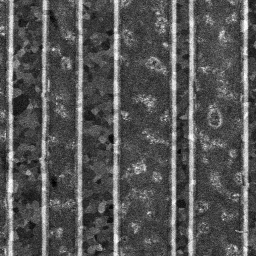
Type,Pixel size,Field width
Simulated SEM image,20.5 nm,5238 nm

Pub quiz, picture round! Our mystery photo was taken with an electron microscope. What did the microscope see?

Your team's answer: one or a few lines or trenches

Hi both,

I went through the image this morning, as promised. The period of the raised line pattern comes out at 1590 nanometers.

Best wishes